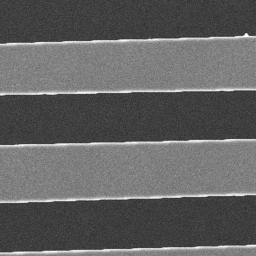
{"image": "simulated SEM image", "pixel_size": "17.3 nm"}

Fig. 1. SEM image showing lines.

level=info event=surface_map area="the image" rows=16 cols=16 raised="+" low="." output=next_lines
................
................
.........+++++++
++++++++++++++++
++++++++++++++++
++++++++++++++++
................
................
................
++++++++++++++++
++++++++++++++++
++++++++++++++++
+++++...........
................
................
..........++++++